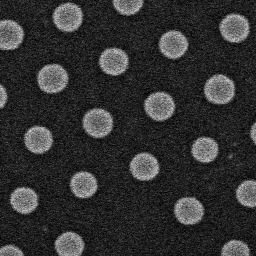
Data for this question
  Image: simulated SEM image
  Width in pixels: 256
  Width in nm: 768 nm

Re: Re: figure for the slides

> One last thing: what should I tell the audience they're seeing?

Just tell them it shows a regular array of raised bodies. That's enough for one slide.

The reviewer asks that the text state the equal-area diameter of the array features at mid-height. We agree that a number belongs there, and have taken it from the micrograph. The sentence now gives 83.3 nm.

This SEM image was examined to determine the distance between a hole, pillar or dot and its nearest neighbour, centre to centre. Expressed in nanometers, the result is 186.